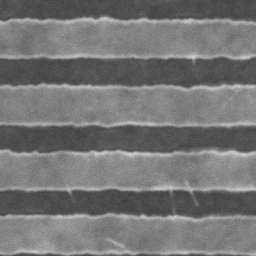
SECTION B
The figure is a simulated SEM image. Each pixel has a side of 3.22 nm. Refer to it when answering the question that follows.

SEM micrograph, lines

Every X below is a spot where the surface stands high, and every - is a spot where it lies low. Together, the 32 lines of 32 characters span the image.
--------------------------------
--------------------------------
-XXX--X--XXXXXX--XX-XXXXXXXXX---
XXXXXXXXXXXXXXXXXXXXXXXXXXXXXXXX
XXXXXXXXXXXXXXXXXXXXXXXXXXXXXXXX
XXXXXXXXXXXXXXXXXXXXXXXXXXXXXXXX
XXXXXXXXXXXXXXXXXXXXXXXXXXXXXXXX
--------------------------------
--------------------------------
--------------------------------
-----X--------------------------
XXXXXXXXXXXXXXXXXXXXXXXXXXXXXXXX
XXXXXXXXXXXXXXXXXXXXXXXXXXXXXXXX
XXXXXXXXXXXXXXXXXXXXXXXXXXXXXXXX
XXXXXXXXXXXXXXXXXXXXXXXXXXXXXXXX
XXXXXXXXXXXXXXXXXXXXXXXXXXXXXXXX
--------------------------------
--------------------------------
--------------------------------
XXXXXXXXXXXXXXXXXXXXXXXXXXXXXXXX
XXXXXXXXXXXXXXXXXXXXXXXXXXXXXXXX
XXXXXXXXXXXXXXXXXXXXXXXXXXXXXXXX
XXXXXXXXXXXXXXXXXXXXXXXXXXXXXXXX
XXXXXXXXXXXXXXXXXXXXXXXXXXXXXXXX
--------------------------------
--------------------------------
--------------------------------
XXXXXXXXXXXXXXXXXXXXXXXXXXXXXXXX
XXXXXXXXXXXXXXXXXXXXXXXXXXXXXXXX
XXXXXXXXXXXXXXXXXXXXXXXXXXXXXXXX
XXXXXXXXXXXXXXXXXXXXXXXXXXXXXXXX
XXXXXXXXXXXXXXXXXXXXXXXXXXXXXXXX